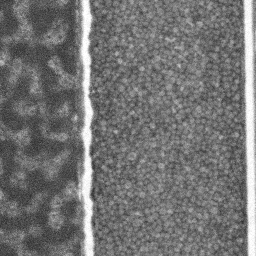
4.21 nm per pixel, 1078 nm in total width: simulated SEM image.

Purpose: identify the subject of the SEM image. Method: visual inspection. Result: one or a few lines or trenches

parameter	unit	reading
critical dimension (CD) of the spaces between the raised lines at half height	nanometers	686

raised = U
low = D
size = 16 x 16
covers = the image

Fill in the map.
UUUUUDDDDDDDDDDD
UUUUUDDDDDDDDDDD
UUUUUDDDDDDDDDDD
UUUUUDDDDDDDDDDD
UUUUUDDDDDDDDDDD
UUUUUDDDDDDDDDDD
UUUUUUDDDDDDDDDD
UUUUUUDDDDDDDDDD
UUUUUDDDDDDDDDDD
UUUUUDDDDDDDDDDD
UUUUUDDDDDDDDDDD
UUUUUDDDDDDDDDDD
UUUUUDDDDDDDDDDD
UUUUUUDDDDDDDDDD
UUUUUUDDDDDDDDDD
UUUUUUDDDDDDDDDD